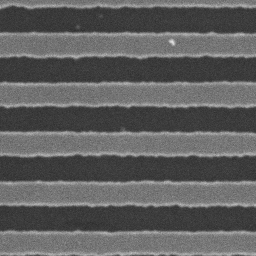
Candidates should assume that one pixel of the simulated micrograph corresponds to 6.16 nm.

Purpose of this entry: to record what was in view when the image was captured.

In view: lines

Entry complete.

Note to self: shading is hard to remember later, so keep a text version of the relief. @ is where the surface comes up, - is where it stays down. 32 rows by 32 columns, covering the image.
@@@@@@@@@@@@@@@@@@@@@@@@@@@@@@@@
--------------------------------
--------------------------------
--------------------------------
@@@@@@@@@@@@@@@@@@@@@@@@@@@@@@@@
@@@@@@@@@@@@@@@@@@@@@@@@@@@@@@@@
@@@@@@@@@@@@@@@@@@@@@@@@@@@@@@@@
--------------------------------
--------------------------------
--------------------------------
@@@@@@@@@@@@@@@@@@@@@@@@@@@@@@@@
@@@@@@@@@@@@@@@@@@@@@@@@@@@@@@@@
@@@@@@@@@@@@@@@@@@@@@@@@@@@@@@@@
--------------------------------
--------------------------------
--------------------------------
----@---@-----------------------
@@@@@@@@@@@@@@@@@@@@@@@@@@@@@@@@
@@@@@@@@@@@@@@@@@@@@@@@@@@@@@@@@
--@@@@@------------@@@---@@-@---
--------------------------------
--------------------------------
--------------------------------
@@@@@@@@@@@@@@@@@@@@@@@@@@@@@@@@
@@@@@@@@@@@@@@@@@@@@@@@@@@@@@@@@
@@@@@@@@@@@@@@@@@@@@@@@@@@@@@@@@
--------------------------------
--------------------------------
--------------------------------
@@@@@@@@@@@@@@@@@@@@@@@@@@@@@@@@
@@@@@@@@@@@@@@@@@@@@@@@@@@@@@@@@
@@@@@@@@@@@@@@@@@@@@@@@@@@@@@@@@